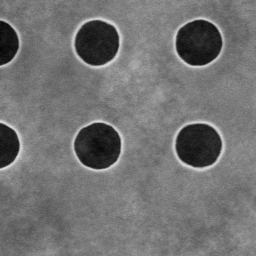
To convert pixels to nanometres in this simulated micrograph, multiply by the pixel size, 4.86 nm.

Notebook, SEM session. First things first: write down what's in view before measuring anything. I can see holes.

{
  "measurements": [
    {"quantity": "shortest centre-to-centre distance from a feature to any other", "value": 492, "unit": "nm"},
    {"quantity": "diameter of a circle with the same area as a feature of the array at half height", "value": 225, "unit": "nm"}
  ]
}